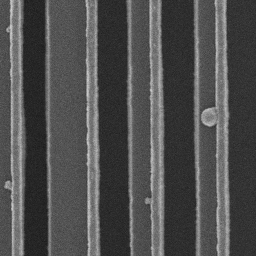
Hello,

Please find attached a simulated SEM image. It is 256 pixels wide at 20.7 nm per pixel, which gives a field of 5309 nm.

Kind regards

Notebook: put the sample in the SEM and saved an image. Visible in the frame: lines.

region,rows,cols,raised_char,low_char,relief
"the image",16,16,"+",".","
+..+++..++..++..
+..+++..++..++..
+..+++..++..++..
+..+++..++..++..
+..+++..++..++..
+..+++..++..++..
+..+++..++..++..
+..+++..++..++..
+..+++..++..++..
+..+++..++..++..
+..+++..++..++..
+..+++..++..++..
+..+++..++..++..
+..+++..++..++..
+..+++..++..++..
+..+++..++..++..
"